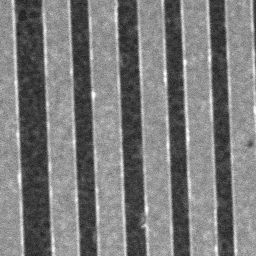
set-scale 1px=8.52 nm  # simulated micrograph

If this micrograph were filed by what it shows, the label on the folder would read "parallel lines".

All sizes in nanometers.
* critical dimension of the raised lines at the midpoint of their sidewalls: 224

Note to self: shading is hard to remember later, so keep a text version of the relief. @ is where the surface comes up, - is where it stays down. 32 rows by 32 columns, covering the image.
@@---@@@@--@@@@--@@@---@@@--@@@-
@@---@@@@--@@@@--@@@---@@@--@@@-
@@----@@@--@@@@--@@@---@@@--@@@-
@@----@@@--@@@@--@@@---@@@--@@@@
@@----@@@--@@@@--@@@@--@@@--@@@@
@@----@@@--@@@@--@@@@--@@@--@@@@
@@----@@@--@@@@--@@@@--@@@--@@@@
@@----@@@--@@@@@--@@@--@@@--@@@@
@@----@@@---@@@---@@@--@@@---@@@
@@----@@@---@@@---@@@--@@@---@@@
@@----@@@---@@@---@@@--@@@---@@@
@@----@@@---@@@---@@@--@@@---@@@
@@----@@@---@@@---@@@--@@@---@@@
@@----@@@---@@@---@@@--@@@---@@@
@@----@@@---@@@---@@@--@@@---@@@
@@----@@@---@@@---@@@--@@@---@@@
@@----@@@---@@@---@@@--@@@@--@@@
@@----@@@---@@@---@@@--@@@@--@@@
@@----@@@---@@@---@@@--@@@@--@@@
@@----@@@---@@@---@@@---@@@--@@@
@@----@@@---@@@---@@@---@@@--@@@
@@----@@@---@@@---@@@---@@@--@@@
@@----@@@@--@@@---@@@---@@@--@@@
@@@---@@@@--@@@---@@@---@@@--@@@
@@@---@@@@--@@@---@@@---@@@--@@@
@@@---@@@@--@@@---@@@---@@@--@@@
@@@---@@@@--@@@---@@@---@@@--@@@
@@@---@@@@--@@@@--@@@---@@@--@@@
@@@----@@@--@@@@--@@@---@@@--@@@
@@@----@@@--@@@@--@@@---@@@--@@@
@@@----@@@--@@@@--@@@@--@@@--@@@
@@@----@@@--@@@@--@@@@--@@@--@@@